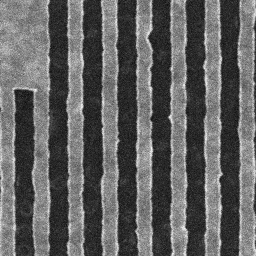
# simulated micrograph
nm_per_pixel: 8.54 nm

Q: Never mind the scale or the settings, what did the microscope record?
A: parallel lines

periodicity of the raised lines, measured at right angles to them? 292 nm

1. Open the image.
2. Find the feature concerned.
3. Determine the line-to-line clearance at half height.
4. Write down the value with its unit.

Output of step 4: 20.1 pixels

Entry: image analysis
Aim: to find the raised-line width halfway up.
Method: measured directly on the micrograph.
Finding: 115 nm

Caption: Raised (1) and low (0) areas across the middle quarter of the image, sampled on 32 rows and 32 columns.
00111000001110000001110000011100
01110000001110000011100000011110
01110000001110000011110000011110
01110000001110000011100000011100
01110000001110000011100000011100
00110000001110000011100000011100
00111000001110000011110000011100
01111000001110000001110000011100
01110000001110000011110000011110
01110000001110000001110000011110
01110000001110000001110000011100
01110000011110000001110000011100
01110000011110000001110000011100
01111000001110000001100000111100
01111000001110000001110000011100
01111000001110000011110000011100
01111000001110000011110000011100
01110000001111000001100000011100
01110000001110000001110000011100
01111000001111000011110000011100
01111000001110000011110000011100
01111000001110000011110000011100
01111000001110000011110000011100
01110000001110000011110000011100
01110000001110000011110000011100
01110000001110000011110000011100
01111000001110000001100000011100
01111000001110000011110000011100
01111000011111000011110000011110
01111000011110000011110000011110
01111000011110000001110000011110
01111000011110000001110000011100